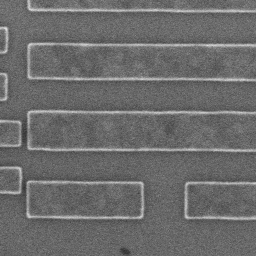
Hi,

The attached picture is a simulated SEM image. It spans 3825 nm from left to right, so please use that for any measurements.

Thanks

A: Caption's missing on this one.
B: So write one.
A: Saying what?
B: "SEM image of wiring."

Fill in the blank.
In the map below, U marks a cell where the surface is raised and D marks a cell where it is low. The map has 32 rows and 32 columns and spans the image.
DDDDUUUUUUUUUUUUUUUUUUUUUUUUUUUU
DDDDDDDDDDDDDDDDDDDDDDDDDDDDDDDD
DDDDDDDDDDDDDDDDDDDDDDDDDDDDDDDD
DDDDDDDDDDDDDDDDDDDDDDDDDDDDDDDD
UDDDDDDDDDDDDDDDDDDDDDDDDDDDDDDD
UDDDDDDDDDDDDDDDDDDDDDDDDDDDDDDD
UDDDUUUUUUUUUUUUUUUUUUUUUUUUUUUU
DDDDUUUUUUUUUUUUUUUUUUUUUUUUUUUU
DDDDUUUUUUUUUUUUUUUUUUUUUUUUUUUU
UDDDUUUUUUUUUUUUUUUUUUUUUUUUUUUU
UDDDDDDDDDDDDDDDDDDDDDDDDDDDDDDD
UDDDDDDDDDDDDDDDDDDDDDDDDDDDDDDD
DDDDDDDDDDDDDDDDDDDDDDDDDDDDDDDD
DDDDDDDDDDDDDDDDDDDDDDDDDDDDDDDD
DDDDUUUUUUUUUUUUUUUUUUUUUUUUUUUU
UUUDUUUUUUUUUUUUUUUUUUUUUUUUUUUU
UUUDUUUUUUUUUUUUUUUUUUUUUUUUUUUU
UUUDUUUUUUUUUUUUUUUUUUUUUUUUUUUU
DDDDUUUUUUUUUUUUUUUUUUUUUUUUUUUU
DDDDDDDDDDDDDDDDDDDDDDDDDDDDDDDD
DDDDDDDDDDDDDDDDDDDDDDDDDDDDDDDD
UUUDDDDDDDDDDDDDDDDDDDDDDDDDDDDD
UUUDDDDDDDDDDDDDDDDDDDDDDDDDDDDD
UUUUUUUUUUUUUUUUUUDDDDDUUUUUUUUU
DDDUUUUUUUUUUUUUUUDDDDDUUUUUUUUU
DDDUUUUUUUUUUUUUUUDDDDDUUUUUUUUU
DDDUUUUUUUUUUUUUUUDDDDDUUUUUUUUU
DDDDDDDDDDDDDDDDDDDDDDDDDDDDDDDD
DDDDDDDDDDDDDDDDDDDDDDDDDDDDDDDD
DDDDDDDDDDDDDDDDDDDDDDDDDDDDDDDD
DDDDDDDDDDDDDDDDDDDDDDDDDDDDDDDD
DDDDDDDDDDDDDDDDDDDDDDDDDDDDDDDD